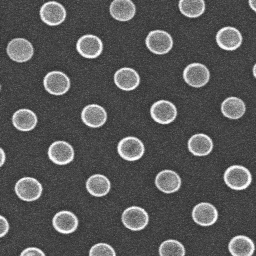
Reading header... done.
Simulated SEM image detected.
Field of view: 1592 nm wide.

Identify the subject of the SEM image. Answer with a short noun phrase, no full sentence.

a regular array of raised bodies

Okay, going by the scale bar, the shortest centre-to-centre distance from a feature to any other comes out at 0.305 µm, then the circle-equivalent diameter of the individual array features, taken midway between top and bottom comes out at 148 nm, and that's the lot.